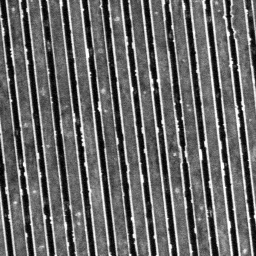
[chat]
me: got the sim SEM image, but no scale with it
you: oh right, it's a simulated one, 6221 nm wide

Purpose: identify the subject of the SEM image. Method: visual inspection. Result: parallel lines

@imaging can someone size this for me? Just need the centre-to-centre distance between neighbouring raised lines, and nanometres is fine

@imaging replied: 494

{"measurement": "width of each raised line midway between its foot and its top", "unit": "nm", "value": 193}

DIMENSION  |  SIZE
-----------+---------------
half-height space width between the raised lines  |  287 nm